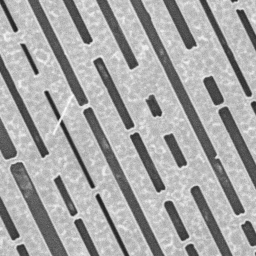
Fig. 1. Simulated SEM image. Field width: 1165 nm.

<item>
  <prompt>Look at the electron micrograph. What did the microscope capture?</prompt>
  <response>parallel lines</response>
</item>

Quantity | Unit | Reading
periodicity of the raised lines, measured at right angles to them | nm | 137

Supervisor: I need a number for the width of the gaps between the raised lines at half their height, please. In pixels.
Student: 10.7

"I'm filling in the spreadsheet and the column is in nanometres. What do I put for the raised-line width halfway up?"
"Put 92.8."